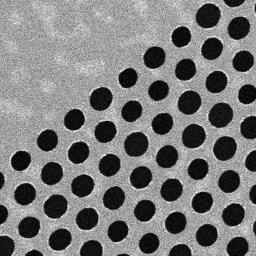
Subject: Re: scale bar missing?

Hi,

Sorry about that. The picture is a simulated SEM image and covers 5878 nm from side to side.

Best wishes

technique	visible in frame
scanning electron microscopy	a regular array of holes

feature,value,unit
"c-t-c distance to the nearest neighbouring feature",761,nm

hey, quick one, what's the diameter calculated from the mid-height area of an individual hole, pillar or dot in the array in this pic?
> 518 nm